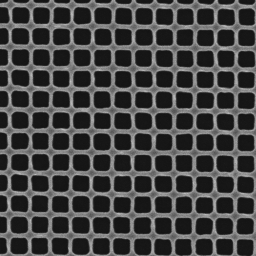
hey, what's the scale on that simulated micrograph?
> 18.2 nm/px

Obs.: a regular array of holes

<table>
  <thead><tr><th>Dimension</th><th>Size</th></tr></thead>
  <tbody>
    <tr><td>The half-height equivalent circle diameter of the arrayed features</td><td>338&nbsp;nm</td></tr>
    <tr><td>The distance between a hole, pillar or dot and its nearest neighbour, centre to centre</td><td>370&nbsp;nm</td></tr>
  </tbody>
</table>